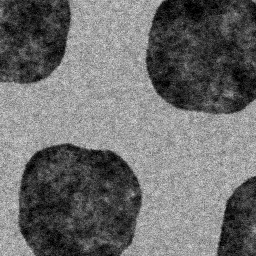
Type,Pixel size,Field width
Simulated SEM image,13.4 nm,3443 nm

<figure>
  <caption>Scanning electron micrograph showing holes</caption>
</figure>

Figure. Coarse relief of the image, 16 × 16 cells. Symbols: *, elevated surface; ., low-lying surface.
....******......
....*****.......
....*****.......
....*****.......
...******.......
**********......
***********.....
****************
****************
**.....*********
**......********
*........******.
*........*****..
*........*****..
*.......******..
**......******..